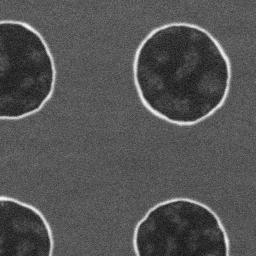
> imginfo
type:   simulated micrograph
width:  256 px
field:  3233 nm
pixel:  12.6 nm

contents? holes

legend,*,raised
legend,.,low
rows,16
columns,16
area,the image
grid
****************
.***************
...******....***
...******.....**
...*****......**
...******.....**
...******.....**
***********.****
****************
****************
****************
****************
****************
..*******....***
...******.....**
...******.....**